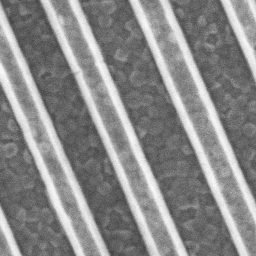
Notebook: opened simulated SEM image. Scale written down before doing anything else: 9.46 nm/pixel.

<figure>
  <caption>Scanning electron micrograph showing one or a few lines or trenches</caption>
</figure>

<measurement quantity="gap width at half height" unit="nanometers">497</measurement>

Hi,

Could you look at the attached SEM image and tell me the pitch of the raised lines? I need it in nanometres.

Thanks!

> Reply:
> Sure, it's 727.